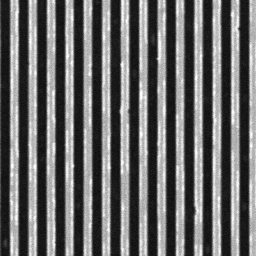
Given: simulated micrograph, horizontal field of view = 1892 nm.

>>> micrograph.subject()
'parallel lines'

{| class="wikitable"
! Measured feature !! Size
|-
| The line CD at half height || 62.8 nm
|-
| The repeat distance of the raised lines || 136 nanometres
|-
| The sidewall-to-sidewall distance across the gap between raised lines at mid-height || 75.7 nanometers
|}